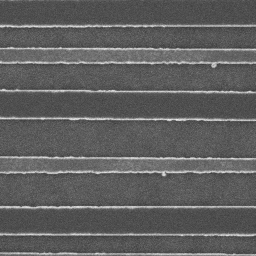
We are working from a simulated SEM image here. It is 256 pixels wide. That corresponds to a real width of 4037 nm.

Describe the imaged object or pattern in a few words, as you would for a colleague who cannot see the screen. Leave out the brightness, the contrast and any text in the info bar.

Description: lines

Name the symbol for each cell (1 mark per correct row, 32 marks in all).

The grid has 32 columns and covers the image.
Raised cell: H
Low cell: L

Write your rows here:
HHHHHHHHHHHHHHHHHHHHHHHHHHHHHHHH
HHHHHHHHHHHHHHHHHHHHHHHHHHHHHHHH
HHHHHHHHHHHHHHHHHHHHHHHHHHHHHHHH
LLLLLLLLLLLLLLLLLLLLLLLLLLLLLLLL
LLLLLLLLLLLLLLLLLLLLLLLLLLLLLLLL
LLLLLLLLLLLLLLLLLLLLLLLLLLLLLLLL
HHHHHHHHHHHHHHHHHHHHHHHHHHHHHHHH
HHHHHHHHHHHHHHHHHHHHHHHHHHHHHHHH
LLLLLLLLLLLLLLLLLLLLLLLLLLLLLLLL
LLLLLLLLLLLLLLLLLLLLLLLLLLLLLLLL
LLLLLLLLLLLLLLLLLLLLLLLLLLLLLLLL
HHHHHHHHHHHHHHHHHHHHHHHHHHHHHHLH
HHHHHHHHHHHHHHHHHHHHHHHHHHHHHHHH
HHHHHHHHHHHHHHHHHHHHHHHHHHHHHHHH
HHHHHHHHHHHHHHHHHHHHHHHHHHHHHHHH
LLLLLLLLLLLLLLLLLLLLLLLLLLLLLLLL
LLLLLLLLLLLLLLLLLLLLLLLLLLLLLLLL
LLLLLLLLLLLLLLLLLLLLLLLLLLLLLLLL
LLLLLLLLLLLLLLLLLLLLLLLLLLLLLLLL
LLLLLLLLLLLLLLLLLLLLLLLLLLLLLLLL
HHHHHHHHHHHHHHHHHHHHHHHHHHHHHHHH
HHHHHHHHHHHHHHHHHHHHHHHHHHHHHHHH
LLLLLLLLLLLLLLLLLLLLLLLLLLLLLLLL
LLLLLLLLLLLLLLLLLLLLLLLLLLLLLLLL
LLLLLLLLLLLLLLLLLLLLLLLLLLLLLLLL
LLLLLLLLLLLLLLLLLLLLLLLLLLLLLLLL
HHHHHHHHHHHHHHHHHHHHHHHHHHHHHHHH
HHHHHHHHHHHHHHHHHHHHHHHHHHHHHHHH
HHHHHHHHHHHHHHHHHHHHHHHHHHHHHHHH
LLLLLLLLLLLLLLLLLLLLLLLLLLLLLLLL
LLLLLLLLLLLLLLLLLLLLLLLLLLLLLLLL
LLLLLLLLLLLLLLLLLLLLLLLLLLLLLLLL